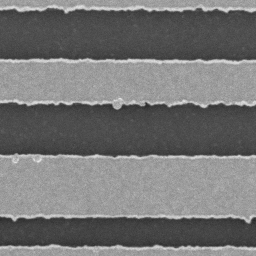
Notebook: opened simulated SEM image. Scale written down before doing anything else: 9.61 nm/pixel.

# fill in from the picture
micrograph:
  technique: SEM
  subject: one or a few lines or trenches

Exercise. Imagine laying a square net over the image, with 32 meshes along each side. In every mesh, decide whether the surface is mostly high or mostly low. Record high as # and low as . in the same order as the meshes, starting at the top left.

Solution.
################################
................................
................................
................................
................................
................................
................................
.......#..#.....................
################################
################################
################################
################################
################################
..............#.................
................................
................................
................................
................................
................................
.########...#...................
################################
################################
################################
################################
################################
################################
################################
................................
................................
................................
................................
################################